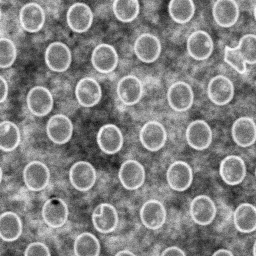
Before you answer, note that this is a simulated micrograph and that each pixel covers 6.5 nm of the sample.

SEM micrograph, a regular array of raised bodies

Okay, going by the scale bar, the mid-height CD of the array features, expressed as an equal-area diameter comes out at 26.7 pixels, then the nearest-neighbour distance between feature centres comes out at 273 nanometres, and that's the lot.